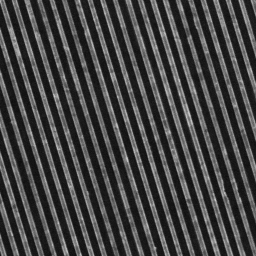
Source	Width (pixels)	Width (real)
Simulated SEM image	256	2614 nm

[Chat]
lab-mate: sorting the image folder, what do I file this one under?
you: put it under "parallel lines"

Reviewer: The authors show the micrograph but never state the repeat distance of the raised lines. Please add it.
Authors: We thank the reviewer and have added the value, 0.123 microns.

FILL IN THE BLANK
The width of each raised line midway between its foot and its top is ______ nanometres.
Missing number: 37.9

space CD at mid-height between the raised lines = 0.0843 um